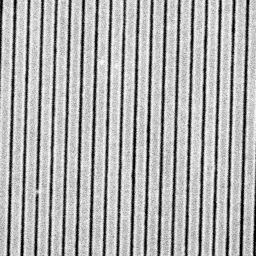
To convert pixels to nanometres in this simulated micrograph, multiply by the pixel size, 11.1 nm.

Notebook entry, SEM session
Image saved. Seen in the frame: parallel lines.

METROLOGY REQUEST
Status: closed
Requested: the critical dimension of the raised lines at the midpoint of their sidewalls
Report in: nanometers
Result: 106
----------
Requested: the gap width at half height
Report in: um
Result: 0.0428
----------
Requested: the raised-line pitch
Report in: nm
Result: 151